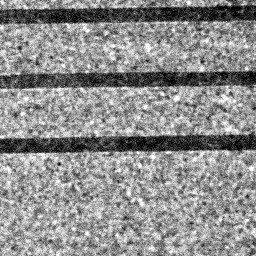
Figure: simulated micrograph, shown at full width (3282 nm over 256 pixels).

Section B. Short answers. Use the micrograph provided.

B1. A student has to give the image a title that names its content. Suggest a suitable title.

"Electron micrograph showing one or a few lines or trenches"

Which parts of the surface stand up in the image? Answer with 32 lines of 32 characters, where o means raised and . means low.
oooooooooooooooooooooooooooooooo
................................
................................
oooooooooooooooooooooooooooooooo
oooooooooooooooooooooooooooooooo
oooooooooooooooooooooooooooooooo
oooooooooooooooooooooooooooooooo
oooooooooooooooooooooooooooooooo
oooooooooooooooooooooooooooooooo
................................
................................
oooooooooooooooooooooooooooooooo
oooooooooooooooooooooooooooooooo
oooooooooooooooooooooooooooooooo
oooooooooooooooooooooooooooooooo
oooooooooooooooooooooooooooooooo
oooooooooooooooooooooooooooooooo
................................
................................
oooooooooooooooooooooooooooooooo
oooooooooooooooooooooooooooooooo
oooooooooooooooooooooooooooooooo
oooooooooooooooooooooooooooooooo
oooooooooooooooooooooooooooooooo
oooooooooooooooooooooooooooooooo
oooooooooooooooooooooooooooooooo
oooooooooooooooooooooooooooooooo
oooooooooooooooooooooooooooooooo
oooooooooooooooooooooooooooooooo
oooooooooooooooooooooooooooooooo
oooooooooooooooooooooooooooooooo
oooooooooooooooooooooooooooooooo